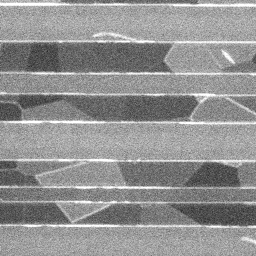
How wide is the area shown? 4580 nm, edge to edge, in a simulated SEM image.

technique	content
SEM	lines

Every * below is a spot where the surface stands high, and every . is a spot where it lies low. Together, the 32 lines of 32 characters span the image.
********************************
................................
................................
................................
................................
********************************
********************************
********************************
********************************
................................
................................
................................
********************************
********************************
********************************
................................
................................
................................
................................
................................
********************************
********************************
********************************
................................
................................
********************************
********************************
********************************
................................
................................
................................
................................